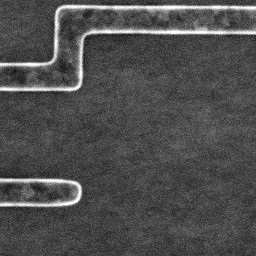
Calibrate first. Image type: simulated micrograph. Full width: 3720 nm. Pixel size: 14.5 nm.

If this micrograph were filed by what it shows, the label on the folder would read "wiring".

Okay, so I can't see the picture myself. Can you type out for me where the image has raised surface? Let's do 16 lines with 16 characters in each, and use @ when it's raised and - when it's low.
----@@@@@@@@@@@@
---@@@@@@@@@@@@@
---@@-----------
---@@-----------
@@@@@-----------
@@@@@-----------
----------------
----------------
----------------
----------------
----------------
@@@@@-----------
@@@@@-----------
----------------
----------------
----------------